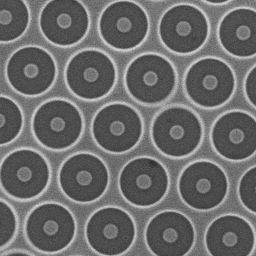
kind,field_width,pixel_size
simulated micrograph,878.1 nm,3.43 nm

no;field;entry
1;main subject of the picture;an array of small figures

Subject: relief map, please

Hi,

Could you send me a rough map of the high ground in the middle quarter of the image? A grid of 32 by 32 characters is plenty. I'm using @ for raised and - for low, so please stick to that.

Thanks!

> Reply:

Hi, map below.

@------------@@@-----------@@@@@
@-----@@-----@@@------------@@@-
-----@@@-----@@------@@-----@@@-
-----@@@-----@@-----@@@-----@@--
@------------@@------@@-----@@--
@-----------@@@@------------@@--
@@----------@@@@------------@@--
@@@--------@@@@@@----------@@@@-
@@@@-----@@@@@@@@@--------@@@@@-
--@@@@@@@@@@@@@@@@@------@@@@@@@
---@@@@@@@@------@@@@@@@@@@--@@@
----@@@@@---------@@@@@@@-------
----@@@@-----------@@@@@--------
----@@@@-----------@@@@---------
-----@@------------@@@----------
-----@@-----@@@-----@@----------
-----@@-----@@@-----@@-----@@@--
----@@@------@-----@@@-----@@@--
----@@@@-----------@@@----------
---@@@@@----------@@@@----------
--@@@@@@@---------@@@@@---------
@@@@@@@@@@@-----@@@@@@@@--------
@@@----@@@@@@@@@@@@@@@@@@------@
@--------@@@@@@@@@@--@@@@@@@@@@@
----------@@@@@@--------@@@@@@@@
----------@@@@@----------@@@@@@-
-----------@@@@----------@@@@@--
----@@-----@@@------------@@@---
---@@@@----@@@-----@@-----@@@---
----@@-----@@@----@@@-----@@@---
-----------@@@-----@@-----@@@---
----------@@@@------------@@@---